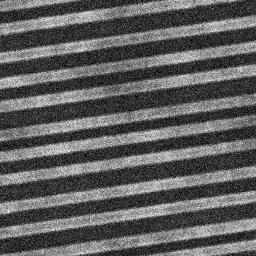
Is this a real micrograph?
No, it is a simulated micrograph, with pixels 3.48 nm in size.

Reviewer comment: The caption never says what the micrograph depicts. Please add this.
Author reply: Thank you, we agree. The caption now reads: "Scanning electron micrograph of parallel lines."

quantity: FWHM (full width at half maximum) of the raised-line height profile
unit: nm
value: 33.2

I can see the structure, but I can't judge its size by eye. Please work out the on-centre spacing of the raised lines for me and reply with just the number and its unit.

87.6 nm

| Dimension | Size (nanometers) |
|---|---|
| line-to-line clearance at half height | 56.1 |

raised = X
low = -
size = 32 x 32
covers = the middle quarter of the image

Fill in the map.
------XXXXXXXXXXXXXXXX----------
XXXXXXXXXXXXXXX-----------------
XXXXXXXX------------------------
X------------------------XXXXXXX
-------------------XXXXXXXXXXXXX
------------XXXXXXXXXXXXXXXXX---
-----XXXXXXXXXXXXXXXXX----------
XXXXXXXXXXXXXXX-----------------
XXXXXXXX------------------------
X-------------------------------
---------------------------XXXXX
--------------------XXXXXXXXXXXX
--------------XXXXXXXXXXXXXXX---
-------XXXXXXXXXXXXXXX----------
XXXXXXXXXXXXXXX-----------------
XXXXXXXX-----------------------X
X-----------------------XXXXXXXX
-----------------XXXXXXXXXXXXXXX
----------XXXXXXXXXXXXXXX-------
---XXXXXXXXXXXXXXXX-------------
XXXXXXXXXXXX--------------------
XXXXX------------------------XXX
----------------------XXXXXXXXXX
---------------XXXXXXXXXXXXXXXX-
--------XXXXXXXXXXXXXXXX--------
-XXXXXXXXXXXXXXXX---------------
XXXXXXXXXX----------------------
XXX-----------------------------
-----------------------------XXX
----------------------XXXXXXXXXX
---------------XXXXXXXXXXXXXXXX-
--------XXXXXXXXXXXXXXXX--------